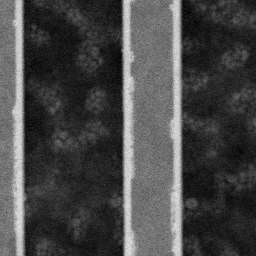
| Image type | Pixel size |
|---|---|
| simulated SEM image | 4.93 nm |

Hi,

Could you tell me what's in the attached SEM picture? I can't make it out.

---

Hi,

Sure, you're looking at one or a few lines or trenches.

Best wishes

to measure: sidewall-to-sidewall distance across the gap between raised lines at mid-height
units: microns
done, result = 0.536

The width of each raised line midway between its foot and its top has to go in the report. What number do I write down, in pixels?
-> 50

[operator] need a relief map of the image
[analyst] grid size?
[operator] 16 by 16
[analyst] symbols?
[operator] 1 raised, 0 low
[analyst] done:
1000000011100000
1000000011100000
1000000011100000
1000000011100000
1000000011100000
1000000011100000
1000000011100000
1000000011100000
1000000011100000
1000000011100000
1000000011100000
1000000011100000
1000000011100000
1000000011100000
1000000011100000
1000000011100000